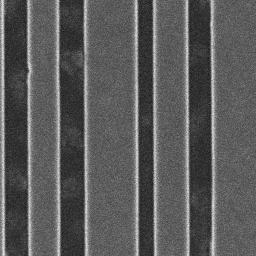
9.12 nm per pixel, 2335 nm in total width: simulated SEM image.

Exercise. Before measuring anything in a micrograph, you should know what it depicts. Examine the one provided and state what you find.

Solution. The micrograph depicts one or a few lines or trenches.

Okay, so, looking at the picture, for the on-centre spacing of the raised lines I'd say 63.7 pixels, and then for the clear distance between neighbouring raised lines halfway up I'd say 229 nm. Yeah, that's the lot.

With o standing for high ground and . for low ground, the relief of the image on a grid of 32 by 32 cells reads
....ooo....oooooo..oooo...oooooo
....ooo....oooooo..oooo...oooooo
....ooo....oooooo..oooo...oooooo
....ooo....oooooo..oooo...oooooo
....ooo....oooooo..oooo...oooooo
....ooo....oooooo..oooo...oooooo
....ooo...ooooooo..oooo...oooooo
....ooo..oooooooo..oooo...oooooo
....ooo....oooooo..oooo...oooooo
....ooo....oooooo..oooo....ooooo
....ooo....oooooo..oooo....ooooo
....ooo....oooooo..oooo....ooooo
....ooo....oooooo..oooo....ooooo
....ooo....oooooo..oooo....ooooo
....ooo....oooooo..oooo....ooooo
....ooo....oooooo..oooo....ooooo
....ooo....oooooo..oooo....ooooo
....ooo....oooooo..oooo....ooooo
....ooo....oooooo..ooooo...ooooo
....ooo....oooooo..ooooo...ooooo
....ooo....oooooo..ooooo...ooooo
....ooo....oooooo..ooooo...ooooo
....ooo....oooooo..ooooo...ooooo
....ooo....oooooo..ooooo...ooooo
....ooo....oooooo..ooooo...ooooo
....ooo....oooooo..ooooo...ooooo
....ooo....oooooo..ooooo...ooooo
....ooo....oooooo..ooooo...ooooo
....ooo....oooooo..ooooo...ooooo
....ooo....oooooo..ooooo...ooooo
....ooo....oooooo..ooooo...ooooo
....ooo....oooooo..ooooo...ooooo